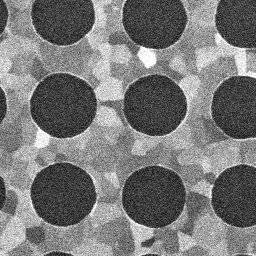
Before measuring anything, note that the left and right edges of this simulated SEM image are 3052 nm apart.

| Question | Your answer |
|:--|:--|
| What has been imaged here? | holes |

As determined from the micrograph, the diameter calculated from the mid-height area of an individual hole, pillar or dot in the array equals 65.3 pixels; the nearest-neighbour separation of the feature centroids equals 1070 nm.